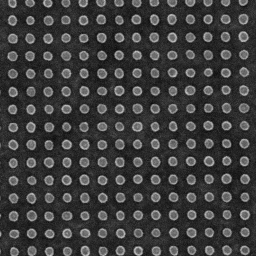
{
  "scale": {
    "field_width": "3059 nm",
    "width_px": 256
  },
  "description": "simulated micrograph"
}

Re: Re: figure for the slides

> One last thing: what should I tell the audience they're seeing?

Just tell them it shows a regular array of raised bodies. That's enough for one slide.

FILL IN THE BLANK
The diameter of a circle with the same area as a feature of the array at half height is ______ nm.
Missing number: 103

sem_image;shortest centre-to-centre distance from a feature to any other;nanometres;206